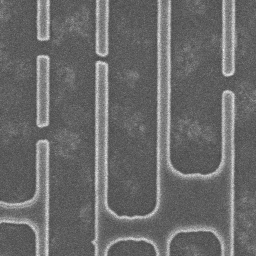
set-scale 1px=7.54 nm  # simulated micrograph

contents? parallel lines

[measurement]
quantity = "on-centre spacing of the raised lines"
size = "466 nanometres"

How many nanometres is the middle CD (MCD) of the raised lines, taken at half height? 81.1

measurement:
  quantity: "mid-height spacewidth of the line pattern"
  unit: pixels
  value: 50.8